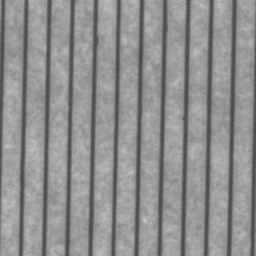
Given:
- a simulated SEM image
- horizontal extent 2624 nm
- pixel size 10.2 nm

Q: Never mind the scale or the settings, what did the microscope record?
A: parallel lines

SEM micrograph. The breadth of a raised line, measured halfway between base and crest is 18.1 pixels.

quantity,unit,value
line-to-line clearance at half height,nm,47.4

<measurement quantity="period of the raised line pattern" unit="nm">237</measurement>